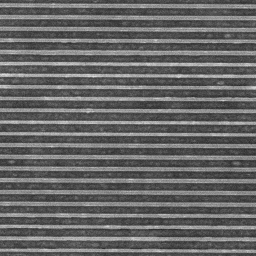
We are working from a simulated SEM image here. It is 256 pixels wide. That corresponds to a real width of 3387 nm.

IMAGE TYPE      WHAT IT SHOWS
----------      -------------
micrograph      parallel lines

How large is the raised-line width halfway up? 47.9 nanometers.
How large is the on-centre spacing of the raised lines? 154 nm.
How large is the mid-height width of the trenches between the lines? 8.13 pixels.